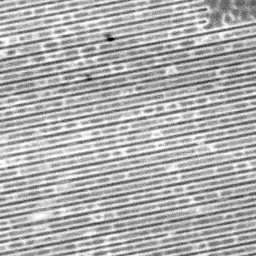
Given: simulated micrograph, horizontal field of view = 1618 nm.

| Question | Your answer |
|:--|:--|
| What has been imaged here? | parallel lines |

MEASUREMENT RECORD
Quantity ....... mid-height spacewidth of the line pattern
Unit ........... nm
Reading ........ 25.6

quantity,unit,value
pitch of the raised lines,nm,75.1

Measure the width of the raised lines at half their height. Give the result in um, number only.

0.0496